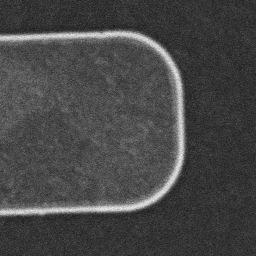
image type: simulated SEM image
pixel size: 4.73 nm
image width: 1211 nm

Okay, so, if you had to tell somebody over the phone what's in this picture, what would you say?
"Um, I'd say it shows one or a few lines or trenches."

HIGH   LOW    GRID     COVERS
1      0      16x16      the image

0000000000000000
0000000000000000
1111111110000000
1111111111000000
1111111111100000
1111111111100000
1111111111100000
1111111111100000
1111111111100000
1111111111100000
1111111111100000
1111111111100000
1111111110000000
0000000000000000
0000000000000000
0000000000000000